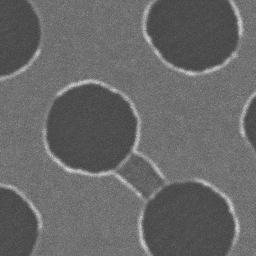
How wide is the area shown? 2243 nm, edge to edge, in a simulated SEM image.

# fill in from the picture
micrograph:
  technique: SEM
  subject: holes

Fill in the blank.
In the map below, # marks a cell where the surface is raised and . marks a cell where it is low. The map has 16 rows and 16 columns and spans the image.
..#######......#
..#######......#
...######......#
..########....##
.###############
####...#########
###.....########
###......######.
###......######.
###.....########
####...#########
###########..###
..#######.....##
..#######......#
..#######......#
..#######.....##